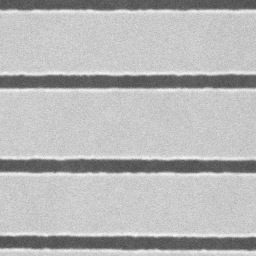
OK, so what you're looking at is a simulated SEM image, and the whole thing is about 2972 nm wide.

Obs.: lines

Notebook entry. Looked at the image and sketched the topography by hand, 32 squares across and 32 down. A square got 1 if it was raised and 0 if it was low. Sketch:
00000000000000000000000000000000
11111111111111111111111111111111
11111111111111111111111111111111
11111111111111111111111111111111
11111111111111111111111111111111
11111111111111111111111111111111
11111111111111111111111111111111
11111111111111111111111111111111
11111111111111111111111111111111
00000000000000000000000000000000
00000000000000000000000000000000
11111111111111111111111111111111
11111111111111111111111111111111
11111111111111111111111111111111
11111111111111111111111111111111
11111111111111111111111111111111
11111111111111111111111111111111
11111111111111111111111111111111
11111111111111111111111111111111
11111111111111111111111111111111
00000000000000000000000000000000
00000000000000000000000000000000
11111111111111111111111111111111
11111111111111111111111111111111
11111111111111111111111111111111
11111111111111111111111111111111
11111111111111111111111111111111
11111111111111111111111111111111
11111111111111111111111111111111
00000000000000000000000001011110
00000000000000000000000000000000
11111111111111111111111111111111